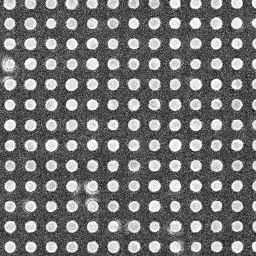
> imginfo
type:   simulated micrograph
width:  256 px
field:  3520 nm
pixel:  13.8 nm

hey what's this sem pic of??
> a regular array of raised bodies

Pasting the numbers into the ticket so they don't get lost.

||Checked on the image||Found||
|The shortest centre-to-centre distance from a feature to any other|20.1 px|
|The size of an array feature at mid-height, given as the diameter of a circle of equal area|141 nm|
